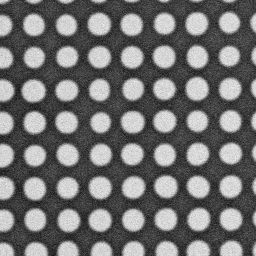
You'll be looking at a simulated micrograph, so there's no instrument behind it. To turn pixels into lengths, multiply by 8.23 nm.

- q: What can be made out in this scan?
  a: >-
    an array of small figures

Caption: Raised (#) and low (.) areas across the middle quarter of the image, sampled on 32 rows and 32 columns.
##......##......##......###.....
................................
................................
................................
##.....###......###....####....#
###....####....#####..######...#
###....####....#####..######...#
###....####....####....####....#
##.....###......##......##......
................................
................................
................................
##......##.....####....####.....
###....####....#####...#####...#
###....####...######...#####...#
###....####....#####...#####...#
###.....###....####.....###.....
................................
................................
................................
##......###.....###.....###.....
###....####....#####...####....#
###....#####...#####...#####...#
###....#####...#####...#####...#
###....####....####....####....#
................................
................................
................................
........##......###.....###.....
###....####....#####...#####...#
###...######...#####...#####...#
###...######...#####...#####...#